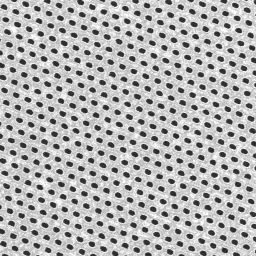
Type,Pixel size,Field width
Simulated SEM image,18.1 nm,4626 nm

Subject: a regular array of holes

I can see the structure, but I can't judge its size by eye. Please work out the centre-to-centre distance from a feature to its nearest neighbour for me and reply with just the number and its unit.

223 nanometres